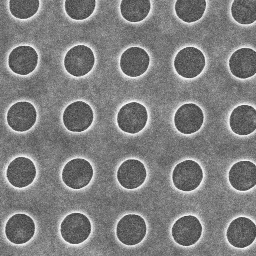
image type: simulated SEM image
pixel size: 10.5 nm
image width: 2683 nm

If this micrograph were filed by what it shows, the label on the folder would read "a regular array of holes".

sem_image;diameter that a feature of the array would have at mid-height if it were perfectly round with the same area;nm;322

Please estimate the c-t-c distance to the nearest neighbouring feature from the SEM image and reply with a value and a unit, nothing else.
577 nanometers